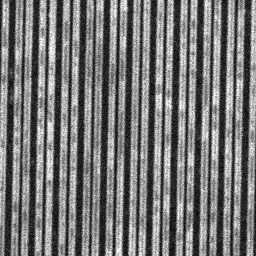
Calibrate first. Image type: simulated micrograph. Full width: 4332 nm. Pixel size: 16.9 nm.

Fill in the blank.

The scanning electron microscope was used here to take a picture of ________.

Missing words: parallel lines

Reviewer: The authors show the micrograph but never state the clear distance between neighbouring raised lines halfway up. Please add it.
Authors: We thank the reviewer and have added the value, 133 nanometres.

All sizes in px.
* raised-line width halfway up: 4.88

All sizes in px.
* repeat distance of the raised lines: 11.8